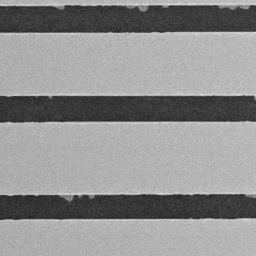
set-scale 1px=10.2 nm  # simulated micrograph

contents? lines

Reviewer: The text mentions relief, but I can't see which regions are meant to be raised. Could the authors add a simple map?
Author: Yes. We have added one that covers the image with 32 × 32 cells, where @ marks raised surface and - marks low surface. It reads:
@@@@@@@@@@@@@@@@@@@@@@@@@@@@@@@@
--------------------------------
--------------------------------
--------------------------------
@@@@@@@@@@@@@@@@@@@@@@@@@@@@@@@@
@@@@@@@@@@@@@@@@@@@@@@@@@@@@@@@@
@@@@@@@@@@@@@@@@@@@@@@@@@@@@@@@@
@@@@@@@@@@@@@@@@@@@@@@@@@@@@@@@@
@@@@@@@@@@@@@@@@@@@@@@@@@@@@@@@@
@@@@@@@@@@@@@@@@@@@@@@@@@@@@@@@@
@@@@@@@@@@@@@@@@@@@@@@@@@@@@@@@@
@@@@@@@@@@@@@@@@@@@@@@@@@@@@@@@@
--------------------------------
--------------------------------
--------------------------------
@@@@@@@@@@@@@@@@@@@@@@@@@@@@@@@@
@@@@@@@@@@@@@@@@@@@@@@@@@@@@@@@@
@@@@@@@@@@@@@@@@@@@@@@@@@@@@@@@@
@@@@@@@@@@@@@@@@@@@@@@@@@@@@@@@@
@@@@@@@@@@@@@@@@@@@@@@@@@@@@@@@@
@@@@@@@@@@@@@@@@@@@@@@@@@@@@@@@@
@@@@@@@@@@@@@@@@@@@@@@@@@@@@@@@@
@@@@@@@@@@@@@@@@@@@@@@@@@@@@@@@@
@@@@@@@@@@@@@@@@@@@@@@@@@@@@@@@@
--------------------------------
--------------------------------
--------------------------------
@@@@@@@@@@@@@@@@@@@@@@@@@@@@@@@@
@@@@@@@@@@@@@@@@@@@@@@@@@@@@@@@@
@@@@@@@@@@@@@@@@@@@@@@@@@@@@@@@@
@@@@@@@@@@@@@@@@@@@@@@@@@@@@@@@@
@@@@@@@@@@@@@@@@@@@@@@@@@@@@@@@@